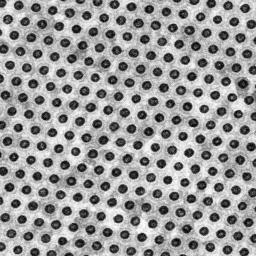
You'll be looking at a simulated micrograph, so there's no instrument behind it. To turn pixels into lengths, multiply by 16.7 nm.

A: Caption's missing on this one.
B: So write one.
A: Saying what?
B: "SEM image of a regular array of holes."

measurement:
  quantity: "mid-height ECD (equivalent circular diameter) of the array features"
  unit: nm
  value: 172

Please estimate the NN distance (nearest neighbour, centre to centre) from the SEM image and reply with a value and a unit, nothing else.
284 nm